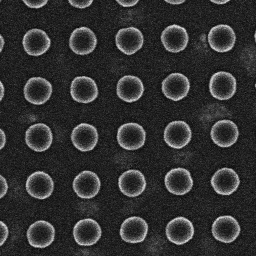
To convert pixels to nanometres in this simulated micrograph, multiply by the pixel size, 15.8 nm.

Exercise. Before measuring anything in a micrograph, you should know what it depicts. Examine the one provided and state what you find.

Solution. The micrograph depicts a regular array of raised bodies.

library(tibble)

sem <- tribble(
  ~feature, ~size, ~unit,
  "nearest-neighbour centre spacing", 729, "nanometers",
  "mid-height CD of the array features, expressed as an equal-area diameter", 421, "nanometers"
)